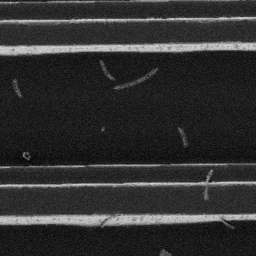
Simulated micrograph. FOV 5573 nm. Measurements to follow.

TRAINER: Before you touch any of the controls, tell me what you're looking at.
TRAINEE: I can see lines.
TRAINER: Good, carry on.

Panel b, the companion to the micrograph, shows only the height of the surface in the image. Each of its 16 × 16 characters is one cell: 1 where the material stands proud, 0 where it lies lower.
1111111111111111
1111111111111111
1111111111111111
0000000000000000
0000000000000000
0000000000000000
0000000000000000
0000000000000000
0000000000000000
0000000000000000
1111111111111111
1111111111111111
1111111111111111
1111111111111111
0000000000000000
0000000000000000